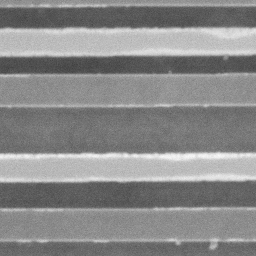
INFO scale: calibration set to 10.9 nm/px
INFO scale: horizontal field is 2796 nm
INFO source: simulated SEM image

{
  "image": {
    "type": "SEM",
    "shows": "lines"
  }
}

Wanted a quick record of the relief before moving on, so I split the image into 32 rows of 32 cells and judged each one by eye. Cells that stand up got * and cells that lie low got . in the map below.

********************************
................................
................................
................................
********************************
********************************
********************************
................................
................................
********************************
********************************
********************************
********************************
................................
................................
................................
................................
................................
................................
.....*******.*****.......*.*****
********************************
********************************
..*******.......................
................................
................................
................................
********************************
********************************
********************************
********************************
................................
................................